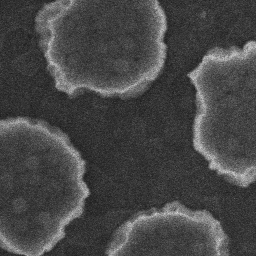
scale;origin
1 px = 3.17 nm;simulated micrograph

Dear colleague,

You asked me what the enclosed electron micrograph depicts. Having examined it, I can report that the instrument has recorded raised bodies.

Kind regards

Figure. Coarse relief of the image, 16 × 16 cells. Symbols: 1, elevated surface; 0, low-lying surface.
0001111111000000
0001111111000000
0001111111000000
0001111111000111
0000111111001111
0000111100001111
0000000000000111
0000000000001111
1111000000001111
1111100000000111
1111100000000011
1111100000000000
1111100000000000
1111100001110000
1111000011111100
0110000111111100